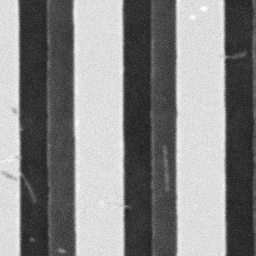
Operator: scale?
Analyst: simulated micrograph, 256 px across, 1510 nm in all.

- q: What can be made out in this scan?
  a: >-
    lines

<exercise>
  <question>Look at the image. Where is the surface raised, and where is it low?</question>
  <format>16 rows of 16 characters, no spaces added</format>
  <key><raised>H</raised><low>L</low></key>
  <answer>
HLLLLHHHLLLHHHLL
HLLLLHHHLLLHHHLL
HLLLLHHHLLLHHHLL
HLLLLHHHLLLHHHLL
HLLLLHHHLLLHHHLL
HLLLLHHHLLLHHHLL
HLLLLHHHLLLHHHLL
HLLLLHHHLLLHHHLL
HLLLLHHHLLLHHHLL
HLLLLHHHLLLHHHLL
HLLLLHHHLLLHHHLL
HLLLLHHHLLLHHHLL
HLLLLHHHLLLHHHLL
HLLLLHHHLLLHHHLL
HLLLLHHHLLLHHHLL
HLLLLHHHLLLHHHLL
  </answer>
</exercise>